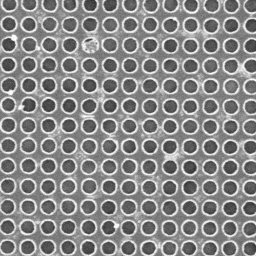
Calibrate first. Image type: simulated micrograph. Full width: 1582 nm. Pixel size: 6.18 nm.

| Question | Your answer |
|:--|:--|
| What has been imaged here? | a regular array of holes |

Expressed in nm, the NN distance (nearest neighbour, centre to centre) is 122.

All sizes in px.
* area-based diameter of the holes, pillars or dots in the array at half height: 14.7